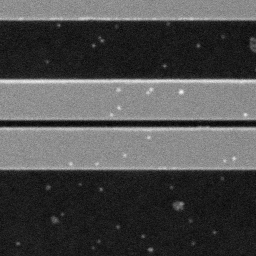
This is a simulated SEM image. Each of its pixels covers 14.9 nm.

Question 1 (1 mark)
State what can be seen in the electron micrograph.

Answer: lines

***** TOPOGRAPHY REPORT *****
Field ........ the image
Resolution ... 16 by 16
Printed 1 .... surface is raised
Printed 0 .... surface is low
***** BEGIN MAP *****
1111111111111111
0000000000000000
0000000000000000
0000000000000000
0000000000000000
1111111111111111
1111111111111111
1111111100101110
1111111111111111
1111111111111111
1111111111111111
0000000000000000
0000000000000000
0000000000000000
0000000000000000
0000000000000000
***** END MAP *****